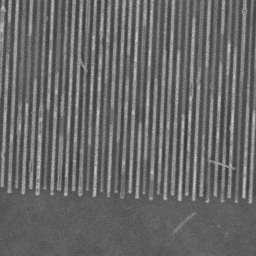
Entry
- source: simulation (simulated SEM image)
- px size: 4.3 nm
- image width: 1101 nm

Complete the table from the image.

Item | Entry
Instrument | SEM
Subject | parallel lines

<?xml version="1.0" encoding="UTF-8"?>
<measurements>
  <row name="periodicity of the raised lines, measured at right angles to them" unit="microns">0.0306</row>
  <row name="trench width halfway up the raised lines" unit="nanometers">19.9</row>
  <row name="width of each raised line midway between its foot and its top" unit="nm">11.8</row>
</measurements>